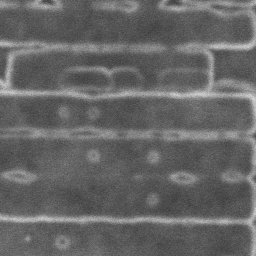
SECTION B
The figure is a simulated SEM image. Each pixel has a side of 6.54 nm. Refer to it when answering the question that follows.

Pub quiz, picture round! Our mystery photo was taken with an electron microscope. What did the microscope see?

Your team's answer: wiring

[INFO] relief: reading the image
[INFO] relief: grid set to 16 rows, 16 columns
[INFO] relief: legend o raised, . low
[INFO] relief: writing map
................
................
................
................
.....oo.........
....ooo.........
oooooooooooooooo
oooooooooooooooo
oooooooooooooooo
oooooooooooooooo
oooooooooooooooo
oooooooooooooooo
oooooooooooooooo
oooooooooooooooo
................
................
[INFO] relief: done